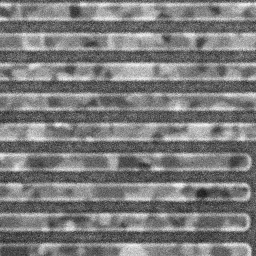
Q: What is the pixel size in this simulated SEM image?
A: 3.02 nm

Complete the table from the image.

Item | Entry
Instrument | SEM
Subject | parallel lines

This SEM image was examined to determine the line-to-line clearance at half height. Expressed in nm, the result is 44.5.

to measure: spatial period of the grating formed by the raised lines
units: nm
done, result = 90.4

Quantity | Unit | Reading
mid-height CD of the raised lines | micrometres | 0.0475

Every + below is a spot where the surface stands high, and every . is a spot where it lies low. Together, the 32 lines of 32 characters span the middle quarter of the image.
++++++++++++++++++++++++++++++++
++++++++++++++++++++++++++++++++
++++++++++++++++++++++++++++++++
++++++++++++++++++++++++++++++++
................................
................................
................................
................................
++++++++++++++++++++++++++++++++
++++++++++++++++++++++++++++++++
++++++++++++++++++++++++++++++++
................................
................................
................................
................................
++++++++++++++++++++++++++++++++
++++++++++++++++++++++++++++++++
++++++++++++++++++++++++++++++++
++++++++++++++++++++++++++++++++
................................
................................
................................
................................
++++++++++++++++++++++++++++++++
++++++++++++++++++++++++++++++++
++++++++++++++++++++++++++++++++
................................
................................
................................
................................
++++++++++++++++++++++++++++++++
++++++++++++++++++++++++++++++++